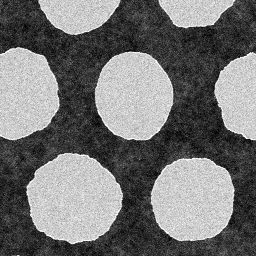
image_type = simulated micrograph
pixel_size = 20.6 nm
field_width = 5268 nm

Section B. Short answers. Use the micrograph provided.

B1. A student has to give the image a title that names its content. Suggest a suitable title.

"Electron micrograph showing raised bodies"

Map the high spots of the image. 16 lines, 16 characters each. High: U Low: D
DDDUUUUDDDUUUUDD
DDDUUUDDDDDUUDDD
DDDDDDDDDDDDDDDD
UUUDDDDUUDDDDDDU
UUUDDDUUUUDDDDUU
UUUUDDUUUUUDDUUU
UUUUDDUUUUUDDDUU
UUUDDDUUUUDDDDUU
UUDDDDDUUDDDDDDU
DDDDDDDDDDDDDDDD
DDDUUUUDDDUUUUDD
DDUUUUUDDDUUUUDD
DDUUUUUUDDUUUUUD
DDUUUUUDDDUUUUDD
DDDUUUUDDDUUUUDD
DDDDDDDDDDDDDDDD